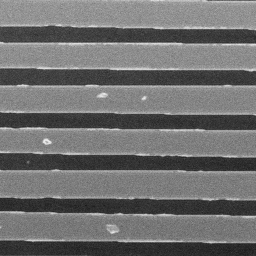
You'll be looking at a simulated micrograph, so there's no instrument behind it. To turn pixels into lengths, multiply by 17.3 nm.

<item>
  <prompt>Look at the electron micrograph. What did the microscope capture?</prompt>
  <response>lines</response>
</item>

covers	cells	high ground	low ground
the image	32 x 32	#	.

################################
################################
################################
...................#############
................................
#######################.........
################################
################################
....############################
................................
................................
################################
################################
################################
................................
................................
################################
################################
################################
...........................#####
................................
################################
################################
################################
################################
................................
................................
################################
################################
################################
................................
................................